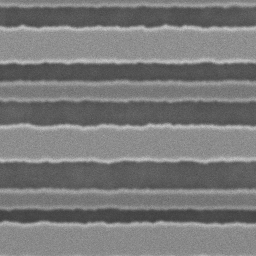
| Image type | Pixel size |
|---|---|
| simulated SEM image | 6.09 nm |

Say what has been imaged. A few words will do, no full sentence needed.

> lines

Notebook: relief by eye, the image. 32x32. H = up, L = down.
HHHHHHHHHHHHHHHHHHHHHHHHHHHHHHHH
LLLLLLLLLLLLLLLLLLLLLLLLLLLLLLLL
LLLLLLLLLLLLLLLLLLLLLLLLLLLLLLLL
HHHHHHHHHHHHHHHHHHHHHHHHHHHHHHHH
HHHHHHHHHHHHHHHHHHHHHHHHHHHHHHHH
HHHHHHHHHHHHHHHHHHHHHHHHHHHHHHHH
HHHHHHHHHHHHHHHHHHHHHHHHHHHHHHHH
HHHHHHHHHHHHHHHHHHHHHHHHHHHHHHHH
LLLLLLLLLLLLLLLLLLLLLLLLLLLLLLLL
LLLLLLLLLLLLLLLLLLLLLLLLLLLLLLLL
HHHHHHHHHHHHHHHHHHHHHHHHHHHHHHHH
HHHHHHHHHHHHHHHHHHHHHHHHHHHHHHHH
HHHHHHHHHHHHHHHHHHHHHHHLHHHHHHHH
LLLLLLLLLLLLLLLLLLLLLLLLLLLLLLLL
LLLLLLLLLLLLLLLLLLLLLLLLLLLLLLLL
LLHLLLLLLLLLLLLLLLLLLLLLLLLLLLLL
HHHHHHHHHHHHHHHHHHHHHHHHHHHHHHHH
HHHHHHHHHHHHHHHHHHHHHHHHHHHHHHHH
HHHHHHHHHHHHHHHHHHHHHHHHHHHHHHHH
HHHHHHHHHHHHHHHHHHHHHHHHHHHHHHHH
LLLLLLLLLLLLLLLLLLLLLLLLLLLLLLLL
LLLLLLLLLLLLLLLLLLLLLLLLLLLLLLLL
LLLLLLLLLLLLLLLLLLLLLLLLLLLLLLLL
LLLLLLLLLLLLLLLLLLLLLLLLLLLLLLLL
HHHHHHHHHHHHHHHHHHHHHHHHHHHHHHHH
HHHHHHHHHHHHHHHHHHHHHHHHHHHHHHHH
LLLLLLLLLLLLLLLLLLLLLLLLLLLLLLLL
LLLLLLLLLLLLLLLLLLLLLLLLLLLLLLLL
HHHHHHHHHHHHHHHHHHHHHHHHHHHHHHHH
HHHHHHHHHHHHHHHHHHHHHHHHHHHHHHHH
HHHHHHHHHHHHHHHHHHHHHHHHHHHHHHHH
HHHHHHHHHHHHHHHHHHHHHHHHHHHHHHHH